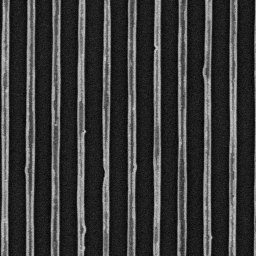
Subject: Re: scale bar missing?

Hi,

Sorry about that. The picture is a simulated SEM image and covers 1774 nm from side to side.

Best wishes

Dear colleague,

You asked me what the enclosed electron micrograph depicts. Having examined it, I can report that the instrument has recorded parallel lines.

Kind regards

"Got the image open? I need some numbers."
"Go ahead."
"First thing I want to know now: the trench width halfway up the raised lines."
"130 nm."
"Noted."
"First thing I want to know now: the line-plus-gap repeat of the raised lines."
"0.175 µm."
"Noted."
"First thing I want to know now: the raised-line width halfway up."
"43.3 nanometers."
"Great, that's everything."